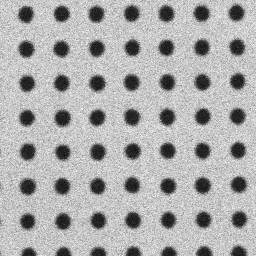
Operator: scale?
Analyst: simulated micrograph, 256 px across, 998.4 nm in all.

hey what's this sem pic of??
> a regular array of holes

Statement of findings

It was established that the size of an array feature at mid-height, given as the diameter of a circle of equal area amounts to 0.0626 µm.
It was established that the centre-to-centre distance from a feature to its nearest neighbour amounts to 133 nm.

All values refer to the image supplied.